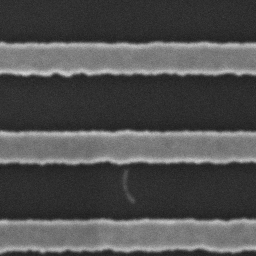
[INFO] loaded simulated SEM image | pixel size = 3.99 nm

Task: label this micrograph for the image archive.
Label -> lines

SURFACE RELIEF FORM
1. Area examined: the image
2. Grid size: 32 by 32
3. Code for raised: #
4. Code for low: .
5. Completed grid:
................................
................................
................................
................................
................................
#.##############..##############
################################
################################
################################
................................
................................
................................
................................
................................
................................
................................
#...#.....###..##.#....##.#...#.
################################
################################
################################
................................
................................
................................
................................
................................
................................
................................
............#.....#....#......#.
################################
################################
################################
................................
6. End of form